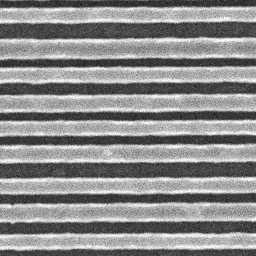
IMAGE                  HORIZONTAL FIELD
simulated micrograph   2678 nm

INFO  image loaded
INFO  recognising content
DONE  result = parallel lines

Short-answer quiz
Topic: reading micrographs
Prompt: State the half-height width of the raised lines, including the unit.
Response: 158 nanometers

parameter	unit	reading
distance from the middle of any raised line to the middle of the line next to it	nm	296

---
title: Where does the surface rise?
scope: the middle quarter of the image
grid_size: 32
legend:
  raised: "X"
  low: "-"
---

--------------------------------
XXXXXXXXXXXXXXXXXXXXXXXXXXXXXXXX
XXXXXXXXXXXXXXXXXXXXXXXXXXXXXXXX
XXXXXXXXXXXXXXXXXXXXXXXXXXXXXXXX
--XX-XXXXXXXXXXXXXX-------------
--------------------------------
--------------------------------
--------------------------------
XXXXXXXXXXXXXXXXXXXXXXXXXXXXXXXX
XXXXXXXXXXXXXXXXXXXXXXXXXXXXXXXX
XXXXXXXXXXXXXXXXXXXXXXXXXXXXXXXX
XXXXXXXXXXXXXXXXXXXXXXXXXXXXXXXX
--------------------------------
--------------------------------
XXXXXXXXXXXXX-XX---XXX-XXXXXXXXX
XXXXXXXXXXXXXXXXXXXXXXXXXXXXXXXX
XXXXXXXXXXXXXXXXXXXXXXXXXXXXXXXX
XXXXXXXXXXXXXXXXXXXXX-XXXXXXX--X
--------------------------------
--------------------------------
--X----------XX--XXXXXXXXXXXXXXX
XXXXXXXXXXXXXXXXXXXXXXXXXXXXXXXX
XXXXXXXXXXXXXXXXXXXXXXXXXXXXXXXX
XXXXXXXXXXXXXXXXXXXXXXXXXXXXXXXX
-XX----X------------------------
--------------------------------
--------------------------------
--------------------------------
---------------X--------X-------
XXXXXXXXXXXXXXXXXXXXXXXXXXXXXXXX
XXXXXXXXXXXXXXXXXXXXXXXXXXXXXXXX
XXXXXXXXXXXXXXXXXXXXXXXXXXXXXXXX